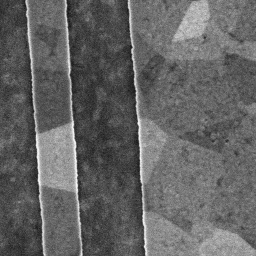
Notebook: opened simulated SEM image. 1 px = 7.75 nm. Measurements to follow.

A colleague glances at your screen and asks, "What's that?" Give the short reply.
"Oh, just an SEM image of one or a few lines or trenches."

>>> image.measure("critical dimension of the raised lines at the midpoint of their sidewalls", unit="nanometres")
298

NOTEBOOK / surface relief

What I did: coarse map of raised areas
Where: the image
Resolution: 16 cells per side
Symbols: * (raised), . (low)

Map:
..**....********
..**....********
..**....********
..**....********
..**....********
..**....********
..**.....*******
..***....*******
..***....*******
..***....*******
..***....*******
..***....*******
...**....*******
...**....*******
...**....*******
...**....*******